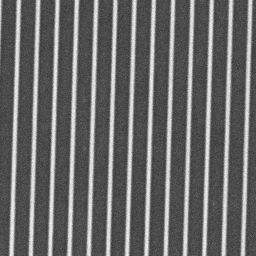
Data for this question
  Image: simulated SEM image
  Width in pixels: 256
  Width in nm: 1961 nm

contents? parallel lines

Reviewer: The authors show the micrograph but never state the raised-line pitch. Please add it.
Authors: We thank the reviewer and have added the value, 0.148 µm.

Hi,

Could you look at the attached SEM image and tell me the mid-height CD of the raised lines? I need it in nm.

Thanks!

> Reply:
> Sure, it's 28.7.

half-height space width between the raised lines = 122 nm